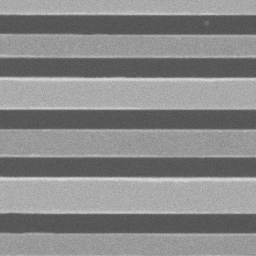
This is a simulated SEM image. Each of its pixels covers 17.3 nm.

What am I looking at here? lines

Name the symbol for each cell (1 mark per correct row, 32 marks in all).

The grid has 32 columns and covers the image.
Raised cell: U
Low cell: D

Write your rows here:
UUUUUUUUUUUUUUUUUUUUUUUUUUUUUUUU
UUUUUUUUUUUUUUUUUUUUUUUUUUUUUUUU
DDDDDDDDDDDDDDDDDDDDDDDDDDDDDDDD
DDDDDDDDDDDDDDDDDDDDDDDDDDDDDDDD
UUUUUUUUUUUUUUUUUUUUUUUUUUUUUUUU
UUUUUUUUUUUUUUUUUUUUUUUUUUUUUUUU
UUUUUUUUUUUUUUUUUUUUUUUUUUUUUUUU
DDDDDDDDDDDDDDDDDDDDDDDDDDDDDDDD
DDDDDDDDDDDDDDDDDDDDDDDDDDDDDDDD
DDDDDDDDDDDDDDDDDDDDDDDDDDDDDDDD
UUUUUUUUUUUUUUUUUUUUUUUUUUUUUUUU
UUUUUUUUUUUUUUUUUUUUUUUUUUUUUUUU
UUUUUUUUUUUUUUUUUUUUUUUUUUUUUUUU
UUUUUUUUUUUUUUUUUUUUUUUUUUUUUUUU
DDDDDDDDDDDDDDDDDDDDDDDDDDDDDDDD
DDDDDDDDDDDDDDDDDDDDDDDDDDDDDDDD
UUUUUUUUUUUUUUUUUUUUUUUUUUUUUUUU
UUUUUUUUUUUUUUUUUUUUUUUUUUUUUUUU
UUUUUUUUUUUUUUUUUUUUUUUUUUUUUUUU
UUUUUUUUUUUUUUUUUUUUUUUUUUUUUUUU
DDDDDDDDDDDDDDDDDDDDDDDDDDDDDDDD
DDDDDDDDDDDDDDDDDDDDDDDDDDDDDDDD
UUUUUUUUUUUUUUUUUUUUUUUUUUUUUUUU
UUUUUUUUUUUUUUUUUUUUUUUUUUUUUUUU
UUUUUUUUUUUUUUUUUUUUUUUUUUUUUUUU
UUUUUUUUUUUUUUUUUUUUUUUUUUUUUUUU
UUUUUUUUUUUUUUUUUUUUUUUUUUUUUUUU
DDDDDDDDDDDDDDDDDDDDDDDDDDDDDDDD
DDDDDDDDDDDDDDDDDDDDDDDDDDDDDDDD
UUUUUUUUUUUUUUUUUUUUUUUUUUUUUUUU
UUUUUUUUUUUUUUUUUUUUUUUUUUUUUUUU
UUUUUUUUUUUUUUUUUUUUUUUUUUUUUUUU